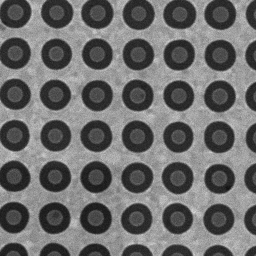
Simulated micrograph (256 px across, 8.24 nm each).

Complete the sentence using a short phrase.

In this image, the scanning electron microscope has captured an array of small figures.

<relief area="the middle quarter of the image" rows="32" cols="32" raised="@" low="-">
-@@@@@-----@@@@@-----@@@@@------
@@@@@@@---@@@@@@@---@@@@@@@@--@@
@@@@@@@@@@@@@@@@@@@@@@@@@@@@@@@@
@@@@@@@@@@@@@@@@@@@@@@@@@@@@@@@@
@@@@@@-----@@@@@-----@@@@@@----@
-@@@@-------@@@-------@@@@------
--@@---@@---@@@--@@@--@@@---@@--
--@@--@@@@--@@---@@@--@@@--@@@--
--@@---@@@--@@---@@@--@@@--@@@--
-@@@@-------@@@---@---@@@---@@--
-@@@@------@@@@-------@@@@------
@@@@@@----@@@@@@@---@@@@@@@----@
@@@@@@@@@@@@@@@@@@@@@@@@@@@@@@@@
@@@@@@@@@@@@@@@@@@@@@@@@@@@@@@@@
@@@@@@----@@@@@@----@@@@@@@@--@@
-@@@@------@@@@------@@@@@-----@
--@@---@@---@@----@---@@@-------
--@@--@@@@--@@---@@@--@@@--@@@--
--@@--@@@@--@@---@@@---@---@@@--
--@@---@@---@@---@@@--@@@---@@--
-@@@@------@@@@-------@@@-------
@@@@@@----@@@@@@-----@@@@@-----@
@@@@@@@@@@@@@@@@@@@@@@@@@@@@@@@@
@@@@@@@@@@@@@@@@@@@@@@@@@@@@@@@@
@@@@@@----@@@@@@@--@@@@@@@@@-@@@
-@@@@------@@@@@-----@@@@------@
--@@@-------@@@-------@@@-------
--@@--@@@@--@@---@@@--@@---@@@--
--@@--@@@@--@@---@@@---@---@@@--
--@@---@@---@@---@@@--@@@--@@@--
-@@@@------@@@@-------@@@-------
@@@@@@-----@@@@@-----@@@@@-----@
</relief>